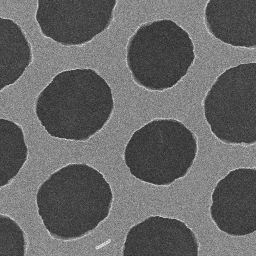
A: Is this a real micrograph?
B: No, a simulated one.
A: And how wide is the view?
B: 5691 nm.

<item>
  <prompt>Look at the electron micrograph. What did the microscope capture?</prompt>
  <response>holes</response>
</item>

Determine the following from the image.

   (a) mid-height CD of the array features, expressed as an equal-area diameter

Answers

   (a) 70.3 pixels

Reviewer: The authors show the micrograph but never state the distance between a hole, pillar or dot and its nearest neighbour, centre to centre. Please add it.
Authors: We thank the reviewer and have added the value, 2150 nanometres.